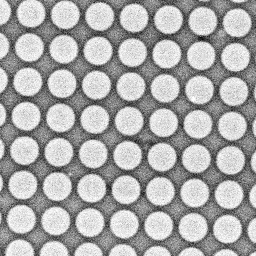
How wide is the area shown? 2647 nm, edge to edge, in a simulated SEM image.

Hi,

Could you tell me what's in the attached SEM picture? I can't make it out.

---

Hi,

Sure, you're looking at an array of small figures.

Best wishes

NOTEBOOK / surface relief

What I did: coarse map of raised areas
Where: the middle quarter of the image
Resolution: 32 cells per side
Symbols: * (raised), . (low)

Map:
........................***.....
................................
**....****.....***..............
***..******...*****....*****....
***..******...******..******...*
***..******..*******..*******..*
**...******..*******..*******..*
**...******...******..******...*
.......**......****....*****...*
................................
*...............................
**...*****....****......**......
**...******..******...******...*
***.*******..*******..******..**
**..*******..*******..******..**
**...******..******...******..**
*....*****....*****...******..**
...............**......****....*
................................
*.....***......**...............
**...*****...*****.....****.....
**..*******..******...*****...**
**..*******..******..*******..**
**..*******..******..*******..**
*....*****...******..*******..**
......***.....****....*****...**
.......................***.....*
................................
*....****.....***......*........
**..******...*****....*****....*
**..******..*******..******...**
**..******..*******..******..***